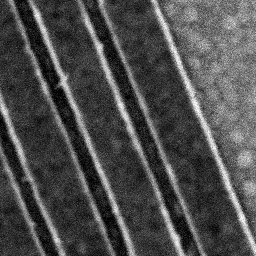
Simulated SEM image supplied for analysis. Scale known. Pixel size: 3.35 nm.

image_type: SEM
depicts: one or a few lines or trenches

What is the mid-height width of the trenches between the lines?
0.0554 micrometres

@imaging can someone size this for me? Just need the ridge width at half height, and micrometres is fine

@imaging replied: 0.169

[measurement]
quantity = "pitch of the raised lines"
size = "222 nanometers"